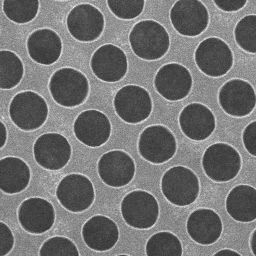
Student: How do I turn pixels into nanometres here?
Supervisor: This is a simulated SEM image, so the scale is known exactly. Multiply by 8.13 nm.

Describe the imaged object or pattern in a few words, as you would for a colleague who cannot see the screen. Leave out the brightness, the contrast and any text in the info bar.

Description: a regular array of holes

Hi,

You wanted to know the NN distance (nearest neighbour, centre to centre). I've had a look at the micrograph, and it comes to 377 nm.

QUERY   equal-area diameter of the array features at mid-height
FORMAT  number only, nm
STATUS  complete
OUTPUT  305